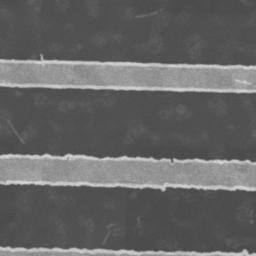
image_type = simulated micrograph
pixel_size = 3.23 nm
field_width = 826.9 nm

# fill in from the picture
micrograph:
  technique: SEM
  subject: one or a few lines or trenches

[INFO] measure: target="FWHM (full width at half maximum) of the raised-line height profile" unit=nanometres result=80.7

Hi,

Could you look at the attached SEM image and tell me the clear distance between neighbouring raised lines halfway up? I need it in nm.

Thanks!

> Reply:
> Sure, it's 220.